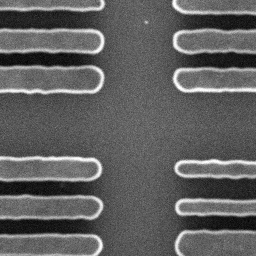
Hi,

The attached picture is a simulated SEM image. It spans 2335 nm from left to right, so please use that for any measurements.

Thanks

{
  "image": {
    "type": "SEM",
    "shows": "groups of lines, slits or small figures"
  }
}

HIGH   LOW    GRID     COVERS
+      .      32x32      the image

+++++++++++++.........++++++++++
.......................+++++++++
................................
................................
+++++++++++++.........++++++++++
+++++++++++++.........++++++++++
++++..++.+++...........+++++.+++
................................
++++++++++++....................
+++++++++++++.........++++++++++
+++++++++++++.........++++++++++
.....+..........................
................................
................................
................................
................................
................................
................................
................................
................................
++++++++++++..........++++++++++
++++++++++++..........++++++++++
++......++......................
................................
...+............................
+++++++++++++.........++++++++++
++++++++++++..........++++++++++
................................
................................
++++++++++++...........+++++++++
+++++++++++++.........++++++++++
++++++++++++..........++++++++++